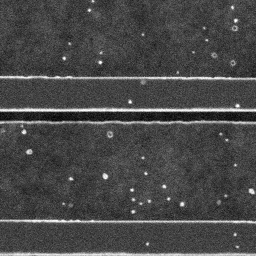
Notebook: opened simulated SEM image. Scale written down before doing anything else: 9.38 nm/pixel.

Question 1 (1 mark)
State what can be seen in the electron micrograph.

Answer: lines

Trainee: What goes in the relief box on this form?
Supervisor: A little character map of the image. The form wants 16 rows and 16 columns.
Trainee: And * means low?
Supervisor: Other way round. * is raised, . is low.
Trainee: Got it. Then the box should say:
................
................
................
................
................
****************
****************
................
................
................
................
................
................
................
****************
****************